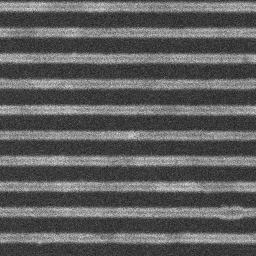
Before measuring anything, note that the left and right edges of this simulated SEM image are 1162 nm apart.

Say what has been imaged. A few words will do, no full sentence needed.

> parallel lines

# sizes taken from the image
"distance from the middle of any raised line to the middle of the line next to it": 0.117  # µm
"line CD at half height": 6.26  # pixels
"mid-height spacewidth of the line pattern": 88.5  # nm